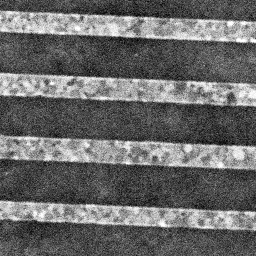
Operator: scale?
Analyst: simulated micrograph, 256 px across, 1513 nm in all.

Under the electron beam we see one or a few lines or trenches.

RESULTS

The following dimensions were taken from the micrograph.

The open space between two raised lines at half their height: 257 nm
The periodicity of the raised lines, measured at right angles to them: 372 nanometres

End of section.